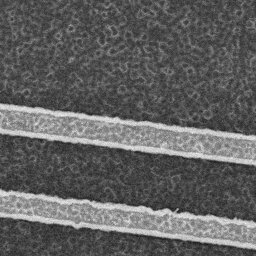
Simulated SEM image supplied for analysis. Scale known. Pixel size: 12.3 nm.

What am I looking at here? one or a few lines or trenches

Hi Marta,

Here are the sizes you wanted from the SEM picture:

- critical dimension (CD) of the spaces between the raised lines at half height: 754 nanometers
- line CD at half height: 0.281 micrometres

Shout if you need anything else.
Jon